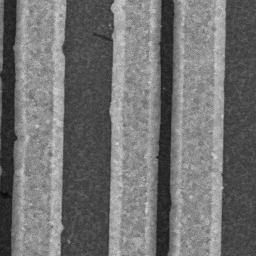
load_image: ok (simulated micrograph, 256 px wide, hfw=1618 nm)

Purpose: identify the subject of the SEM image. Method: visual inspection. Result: one or a few lines or trenches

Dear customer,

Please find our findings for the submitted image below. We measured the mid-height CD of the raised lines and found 246 nanometers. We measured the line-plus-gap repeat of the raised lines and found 502 nm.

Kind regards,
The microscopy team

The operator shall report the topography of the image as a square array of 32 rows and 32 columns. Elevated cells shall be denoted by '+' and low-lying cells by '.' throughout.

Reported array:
...++++........++++...++++++....
...++++........++++...++++++....
...++++........++++...++++++....
...++++........++++...++++++....
...++++........++++...++++++....
..+++++........++++...++++++....
..+++++........++++...+++++.....
...++++........++++...+++++.....
...++++........++++...+++++.....
...++++........++++...+++++.....
...++++........++++...+++++.....
...++++........++++...+++++.....
...++++........++++...+++++.....
...++++.......+++++...+++++.....
...++++.......+++++...+++++.....
...++++........++++...+++++.....
...++++........++++...+++++.....
...++++........++++...+++++.....
..+++++........++++...+++++.....
...++++........++++...+++++.....
..+++++........++++...+++++.....
..+++++........++++...+++++.....
..+++++........++++...+++++.....
..+++++........++++...+++++.....
..+++++........++++...+++++.....
..+++++.......+++++...+++++.....
..+++++.......+++++...+++++.....
..+++++.......+++++...+++++.....
..+++++.......+++++...+++++.....
..+++++.......+++++...+++++.....
..+++++.......+++++...+++++.....
..+++++.......+++++...+++++.....